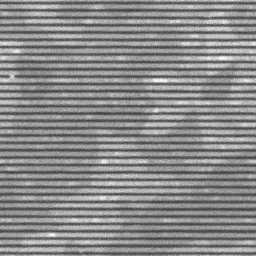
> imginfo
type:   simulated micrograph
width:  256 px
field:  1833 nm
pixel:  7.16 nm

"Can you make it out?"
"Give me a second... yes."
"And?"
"parallel lines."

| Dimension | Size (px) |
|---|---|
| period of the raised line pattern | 7.36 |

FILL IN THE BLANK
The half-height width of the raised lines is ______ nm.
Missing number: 30.4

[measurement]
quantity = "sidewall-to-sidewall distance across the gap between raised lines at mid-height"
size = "0.0242 µm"